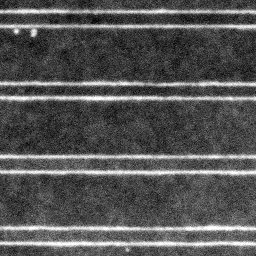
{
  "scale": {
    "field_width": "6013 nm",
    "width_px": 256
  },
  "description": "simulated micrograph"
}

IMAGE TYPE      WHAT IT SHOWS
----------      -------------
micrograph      lines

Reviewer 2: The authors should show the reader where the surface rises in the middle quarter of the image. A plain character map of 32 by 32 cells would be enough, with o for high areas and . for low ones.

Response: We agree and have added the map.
oooooooooooooooooooooooooooooooo
oooooooooooooooooooooooooooooooo
oooooooooooooooooooooooooooooooo
oooooooooooooooooooooooooooooooo
oooooooooooooooooooooooooooooooo
................................
................................
................................
.ooooo.........oooooooooo...o...
oooooooooooooooooooooooooooooooo
oooooooooooooooooooooooooooooooo
oooooooooooooooooooooooooooooooo
oooooooooooooooooooooooooooooooo
oooooooooooooooooooooooooooooooo
oooooooooooooooooooooooooooooooo
oooooooooooooooooooooooooooooooo
oooooooooooooooooooooooooooooooo
oooooooooooooooooooooooooooooooo
oooooooooooooooooooooooooooooooo
oooooooooooooooooooooooooooooooo
oooooooooooooooooooooooooooooooo
oooooooooooooooooooooooooooooooo
oooooooooooooooooooooooooooooooo
................................
................................
................................
................................
oooooooooooooooooooooooooooooooo
oooooooooooooooooooooooooooooooo
oooooooooooooooooooooooooooooooo
oooooooooooooooooooooooooooooooo
oooooooooooooooooooooooooooooooo